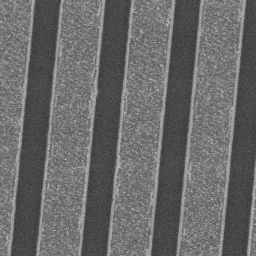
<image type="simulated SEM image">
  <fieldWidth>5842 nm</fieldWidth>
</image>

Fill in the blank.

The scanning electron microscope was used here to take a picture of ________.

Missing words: one or a few lines or trenches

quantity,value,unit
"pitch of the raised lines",1.6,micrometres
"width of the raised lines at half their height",957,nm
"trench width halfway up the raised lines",650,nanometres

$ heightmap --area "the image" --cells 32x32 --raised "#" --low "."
####....#####....#####...######.
####....#####...######...#####..
####....#####...#####....#####..
####...######...#####....#####..
####...######...#####....#####..
####...#####....#####....#####..
####...#####....#####....#####..
###....#####....#####....#####..
###....#####....#####....#####..
###....#####....#####...######..
###....#####....#####...######..
###....#####...######...#####...
###....#####...######...#####...
###...######...#####....#####...
###...######...#####....#####...
###...#####....#####....#####...
###...#####....#####....#####...
###...#####....#####....#####...
##....#####....#####....#####...
##....#####....#####...######...
##....#####....#####...######...
##....#####....#####...######...
##....#####...######...#####....
##...######...#####....#####....
##...######...#####....#####....
##...######...#####....#####....
##...#####....#####....#####....
##...#####....#####....#####...#
#....#####....#####....#####...#
#....#####....#####....#####...#
#....#####....#####...######...#
#....#####....#####...######...#